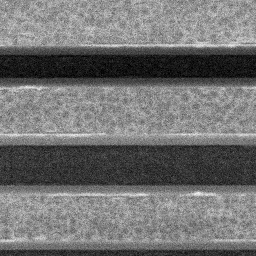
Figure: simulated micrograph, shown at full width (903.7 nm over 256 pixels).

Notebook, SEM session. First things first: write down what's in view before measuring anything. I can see one or a few lines or trenches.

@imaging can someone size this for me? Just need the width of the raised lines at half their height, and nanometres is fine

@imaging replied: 195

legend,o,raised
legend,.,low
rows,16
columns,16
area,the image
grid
oooooooooooooooo
oooooooooooooooo
oooooooooooooooo
................
................
oooooooooooooooo
oooooooooooooooo
oooooooooooooooo
oooooooooooooooo
................
................
................
oooooooooooooooo
oooooooooooooooo
oooooooooooooooo
................